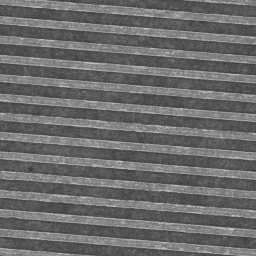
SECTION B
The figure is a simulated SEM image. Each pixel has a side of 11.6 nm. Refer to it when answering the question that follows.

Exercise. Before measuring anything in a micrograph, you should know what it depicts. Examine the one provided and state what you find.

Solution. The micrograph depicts parallel lines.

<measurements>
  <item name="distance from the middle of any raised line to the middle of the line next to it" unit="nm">223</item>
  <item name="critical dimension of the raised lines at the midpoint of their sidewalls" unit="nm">82.3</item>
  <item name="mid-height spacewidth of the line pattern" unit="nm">143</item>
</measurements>